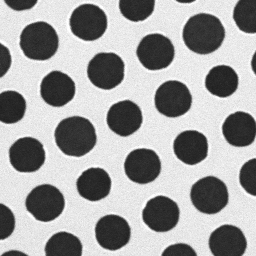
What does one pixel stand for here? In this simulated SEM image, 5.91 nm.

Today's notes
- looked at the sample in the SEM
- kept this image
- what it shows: a regular array of holes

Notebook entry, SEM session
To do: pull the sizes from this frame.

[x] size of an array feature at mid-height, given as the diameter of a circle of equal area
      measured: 218 nm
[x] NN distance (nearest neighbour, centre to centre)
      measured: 0.303 micrometres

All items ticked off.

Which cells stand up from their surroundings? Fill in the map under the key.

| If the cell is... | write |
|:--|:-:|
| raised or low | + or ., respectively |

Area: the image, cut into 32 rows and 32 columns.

+...+++++++++++....+++++++++++..
+++++++++....++....++++++++++...
+++++++++....+++..++++++...++...
+++....++....++++++++++.....++..
+++....++....+++++...++.....++++
++.....++++++++++.....+.....++++
.++....++++++++++.....++..++++++
.+++..+++++....++.....+++++++++.
.++++++++++.....++...++++++..+++
++++++...++.....++++++++++....++
+++++....+++...+++++...+++....++
..+++....++++++++++.....++...+++
...+++...++++++++++.....++++++++
...+++++++++++...+++....++++++++
...++++++++++.....+++..++++++..+
+++++++....++.....++++++++++....
+++++++.....++...++++++..+++....
++...++.....++++++++++....++....
+....++.....++++++++++....++++++
+.....+++.++++++....++....++++++
+....+++++++++++....+++..++++++.
++..++++++...+++....++++++++++..
++++++++++....++...++++++...++..
++++...+++....++++++++++....++..
+++.....++...+++++++++++.....+++
+++.....++++++++++....++....++++
.+++....++++++++++....+++..+++++
..+++..+++++....++....++++++++++
..++++++++++....+++...+++++...++
.++++++..+++....++++++++++.....+
++++++....++....++++++.+++.....+
+..+++....++++++++++....++.....+